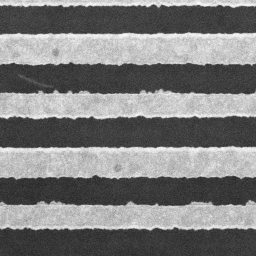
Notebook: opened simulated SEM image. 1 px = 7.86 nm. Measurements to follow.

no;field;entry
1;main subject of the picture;lines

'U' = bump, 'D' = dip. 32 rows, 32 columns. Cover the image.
UUUUUUUUUUUUUUUUUUUUUUUUUUUUUUUU
DDDDDDDDDDDDDDDDDDDDDDDDDDDDDDDD
DDDDDDDDDDDDDDDDDDDDDDDDDDDDDDDD
DDDDDDDDDDDDDDDDDDDDDDDDDDDDDDDD
UUUUUUUUUUUUUUUUUUUUUUUUUUUUUUUU
UUUUUUUUUUUUUUUUUUUUUUUUUUUUUUUU
UUUUUUUUUUUUUUUUUUUUUUUUUUUUUUUU
UUUUUUUUUUUUUUUUUUUUUUUUUUUUUUUU
DDDDDDDDDDDDDDDDDDDDDDDDDDDDDDDD
DDDDDDDDDDDDDDDDDDDDDDDDDDDDDDDD
DDDDDDDDDDDDDDDDDDDDDDDDDDDDDDDD
DDDDDDDDDDDDDDDDDDDDDDDDDDDDDDDD
UUUUUUUUUUUUUUUUUUUUUUUUUUUUUUUU
UUUUUUUUUUUUUUUUUUUUUUUUUUUUUUUU
UDDUUUDUUUUUUUUDUDUUUDUUDUUUDDDD
DDDDDDDDDDDDDDDDDDDDDDDDDDDDDDDD
DDDDDDDDDDDDDDDDDDDDDDDDDDDDDDDD
DDDDDDDDDDDDDDDDDDDDDDDDDDDDDDDD
DDDDDDDDDDDDDDDDDDDDDDDDDDDDUDDD
UUUUUUUUUUUUUUUUUUUUUUUUUUUUUUUU
UUUUUUUUUUUUUUUUUUUUUUUUUUUUUUUU
UUUUUUUUUUUUUUUUUUUUUUUUUUUUUUUU
DDDDDDDDDDDDDDDDDDDDDDDDDDDDDDDD
DDDDDDDDDDDDDDDDDDDDDDDDDDDDDDDD
DDDDDDDDDDDDDDDDDDDDDDDDDDDDDDDD
DDDDDDDDDDDDDDDDDDDDDDDDDDDDDDDD
UUUUUUUUUUUUUUUUUUUUUUUUUUUUUUUU
UUUUUUUUUUUUUUUUUUUUUUUUUUUUUUUU
UUUDUUUUUUUUUUUUDUUDUDUUUUUUUDUD
DDDDDDDDDDDDDDDDDDDDDDDDDDDDDDDD
DDDDDDDDDDDDDDDDDDDDDDDDDDDDDDDD
DDDDDDDDDDDDDDDDDDDDDDDDDDDDDDDD